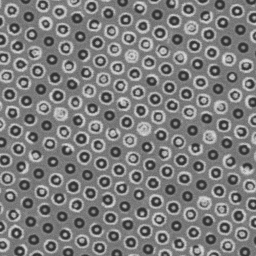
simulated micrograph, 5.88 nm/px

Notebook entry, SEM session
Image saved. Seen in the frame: a regular array of ring-shaped grooves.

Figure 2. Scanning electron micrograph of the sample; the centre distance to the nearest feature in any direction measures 106 nm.